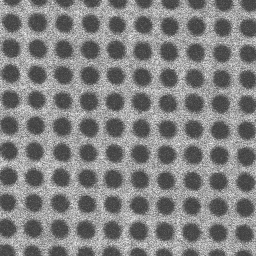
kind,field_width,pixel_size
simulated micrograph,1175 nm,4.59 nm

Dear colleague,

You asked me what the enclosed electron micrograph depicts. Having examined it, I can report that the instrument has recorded a regular array of holes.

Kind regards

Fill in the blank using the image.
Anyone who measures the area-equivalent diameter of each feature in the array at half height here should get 18.8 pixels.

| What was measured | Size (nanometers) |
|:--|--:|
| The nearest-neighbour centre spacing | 117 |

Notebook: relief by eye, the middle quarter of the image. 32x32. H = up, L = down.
HHHHHHHHHHHHHHHHHHHHHHHHHHHHHHHH
LLHHHLLLHHHLLLHHHHLLLHHHHLLHHHHL
LLHHLLLLLHHLLLLHHLLLLLHHLLLLHHHL
LLHHLLLLLHHLLLLHHLLLLLHHLLLLLHLL
LLHHHLLLHHHLLLLHHHLLLLHHLLLLHHHL
HHHHHHHHHHHHHHHHHHHLHHHHHLLLHHHH
HHHHHHHHHHHHHHHHHHHHHHHHHHHHHHHH
LHHHHLLLHHHLLLHHHHLLHHHHHLHHHHHH
LLHHLLLLHHHLLLLHHLLLLHHHLLLLHHHL
LLHHLLLLLHLLLLLHHLLLLLHHLLLLHHLL
LLHHLLLLHHHLLLLHHLLLLLHHLLLLHHLL
LHHHHLLLHHHHLLHHHHLLLHHHLLLLHHHL
HHHHHHHHHHHHHHHHHHHHHHHHHHHHHHHH
HHHHHHLHHHHHLHHHHHHHHHHHHHHHHHHH
LLHHLLLLHHHLLLLHHHLLLHHHLLLHHHHL
LLHHLLLLLHLLLLLHHLLLLLHHLLLLHHLL
LLHHLLLLLHLLLLLHHLLLLLHHLLLLHHLL
LHHHHLLLHHHLLLLHHLLLLHHHLLLLHHHL
HHHHHHHHHHHHHHHHHHHLHHHHHLLHHHHL
HHHHHHHHHHHHHHHHHHHHHHHHHHHHHHHH
LHHHHLLHHHHLLLHHHHLLHHHHHLLHHHHL
LLHHLLLLHHLLLLLHHLLLLHHHLLLLHHLL
LLHHLLLLHHLLLLLHHLLLLHHLLLLLHHLL
LLHHLLLLHHHLLLLHHLLLLHHHLLLLHHLL
HHHHHLLHHHHHLLHHHHLLLHHHLLLHHHHL
HHHHHHHHHHHHHHHHHHHHHHHHHHHHHHHH
HHHHHLLHHHHLLHHHHHHHHHHHHHHHHHHH
LHHLLLLLHHLLLLHHHLLLLHHHLLLHHHHL
LHHLLLLLHHLLLLLHHLLLLHHLLLLLHHLL
LHHHLLLLHHLLLLLHHLLLLHHLLLLLHHLL
LHHHLLLHHHHLLLHHHLLLLHHHLLLHHHLL
HHHHHHHHHHHHHHHHHHHHHHHHHHHHHHHL